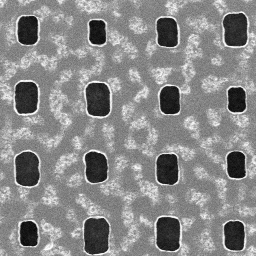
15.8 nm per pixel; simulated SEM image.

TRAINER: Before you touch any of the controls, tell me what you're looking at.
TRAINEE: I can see a regular array of holes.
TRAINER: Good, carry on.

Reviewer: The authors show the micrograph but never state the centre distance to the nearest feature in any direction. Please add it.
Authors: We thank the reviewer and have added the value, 1.06 micrometres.